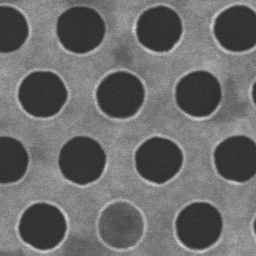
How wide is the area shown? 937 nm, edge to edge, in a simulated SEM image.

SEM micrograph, a regular array of holes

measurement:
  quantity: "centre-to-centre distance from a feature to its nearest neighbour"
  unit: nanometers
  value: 275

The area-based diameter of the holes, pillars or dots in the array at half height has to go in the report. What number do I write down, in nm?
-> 171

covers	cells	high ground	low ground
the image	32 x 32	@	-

@@@@@@@@@@@@@@@@@@@@@@@@@@@@@@@@
--@@@@@@----@@@@@@----@@@@@@----
---@@@@------@@@@-----@@@@@-----
----@@@------@@@@------@@@@-----
---@@@@------@@@@------@@@@-----
---@@@@@----@@@@@@----@@@@@@----
-@@@@@@@@--@@@@@@@@@@@@@@@@@@@@@
@@@@@@@@@@@@@@@@@@@@@@@@@@@@@@@@
@@@@@@@@@@@@@@@@@@@@@@@@@@@@@@@@
@@@----@@@@@@@---@@@@@@----@@@@@
@@@-----@@@@@-----@@@@-----@@@@@
@@------@@@@------@@@@------@@@@
@@------@@@@------@@@@------@@@@
@@@-----@@@@@----@@@@@@----@@@@@
@@@@--@@@@@@@@--@@@@@@@@--@@@@@@
@@@@@@@@@@@@@@@@@@@@@@@@@@@@@@@@
@@@@@@@@@@@@@@@@@@@@@@@@@@@@@@@@
--@@@@@@@---@@@@@@---@@@@@@@---@
---@@@@@-----@@@@-----@@@@@-----
----@@@------@@@@------@@@@-----
----@@@------@@@@------@@@@-----
---@@@@@-----@@@@-----@@@@@-----
--@@@@@@@---@@@@@@---@@@@@@@@--@
@@@@@@@@@@@@@@@@@@@@@@@@@@@@@@@@
@@@@@@@@@@@@@@@@@@@@@@@@@@@@@@@@
@@@@--@@@@@@@@-@@@@@@@@@--@@@@@@
@@@-----@@@@@----@@@@@@----@@@@@
@@@-----@@@@@-----@@@@------@@@@
@@------@@@@@-----@@@@------@@@@
@@@-----@@@@@@---@@@@@-----@@@@@
@@@----@@@@@@@--@@@@@@@----@@@@@
@@@@@@@@@@@@@@@@@@@@@@@@@@@@@@@@